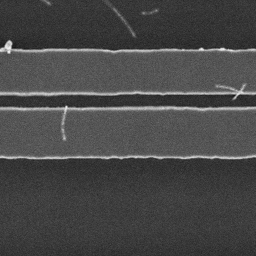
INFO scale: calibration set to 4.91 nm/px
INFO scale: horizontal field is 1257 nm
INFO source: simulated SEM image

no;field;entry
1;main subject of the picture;lines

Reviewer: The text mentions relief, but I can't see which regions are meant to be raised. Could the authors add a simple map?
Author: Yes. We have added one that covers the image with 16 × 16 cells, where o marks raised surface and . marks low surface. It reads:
................
................
................
oooooooooooooooo
oooooooooooooooo
oooooooooooooooo
oooooooooooooooo
oooooooooooooooo
oooooooooooooooo
oooooooooooooooo
................
................
................
................
................
................